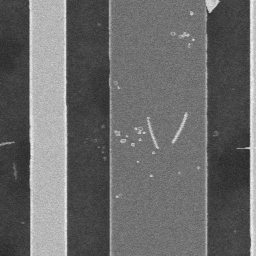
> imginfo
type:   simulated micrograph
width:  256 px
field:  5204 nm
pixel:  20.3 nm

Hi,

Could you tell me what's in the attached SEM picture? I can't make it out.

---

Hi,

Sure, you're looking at lines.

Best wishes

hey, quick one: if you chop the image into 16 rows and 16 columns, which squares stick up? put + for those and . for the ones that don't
..++...++++++...
..++...++++++...
..++...++++++...
..++...++++++...
..++...++++++...
..++...++++++...
..++...++++++...
..++...++++++...
..++...++++++...
..++...++++++...
..++...++++++...
..++...++++++...
..++...++++++...
..++...++++++...
..++...++++++...
..++...++++++...